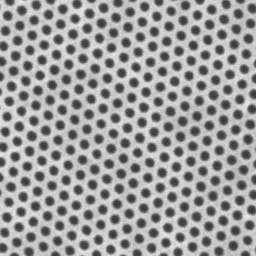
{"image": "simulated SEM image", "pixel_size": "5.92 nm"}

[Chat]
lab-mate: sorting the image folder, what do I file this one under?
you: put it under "a regular array of holes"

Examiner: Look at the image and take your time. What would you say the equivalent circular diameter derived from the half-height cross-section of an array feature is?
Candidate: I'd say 63.4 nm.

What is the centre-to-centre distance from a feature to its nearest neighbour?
89.6 nm